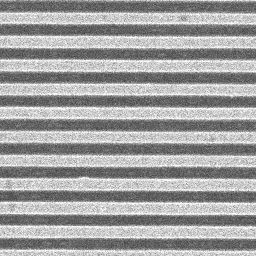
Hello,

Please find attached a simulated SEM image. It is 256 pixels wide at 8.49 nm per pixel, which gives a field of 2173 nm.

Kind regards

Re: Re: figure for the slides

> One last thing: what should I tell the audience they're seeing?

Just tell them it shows parallel lines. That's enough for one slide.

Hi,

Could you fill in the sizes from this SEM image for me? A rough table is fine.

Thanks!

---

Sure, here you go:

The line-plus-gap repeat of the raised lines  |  201 nm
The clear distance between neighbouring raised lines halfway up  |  83.9 nanometres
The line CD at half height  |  118 nm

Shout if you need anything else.